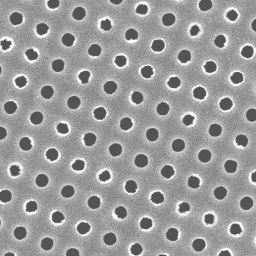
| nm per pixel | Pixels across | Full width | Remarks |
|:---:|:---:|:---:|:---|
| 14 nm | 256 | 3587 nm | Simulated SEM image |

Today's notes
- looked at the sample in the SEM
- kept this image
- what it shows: a regular array of holes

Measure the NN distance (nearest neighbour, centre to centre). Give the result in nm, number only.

389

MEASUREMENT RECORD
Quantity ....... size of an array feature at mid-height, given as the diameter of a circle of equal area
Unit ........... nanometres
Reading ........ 182